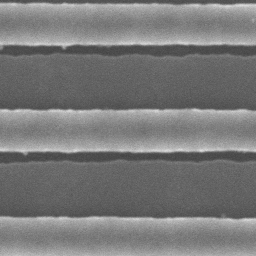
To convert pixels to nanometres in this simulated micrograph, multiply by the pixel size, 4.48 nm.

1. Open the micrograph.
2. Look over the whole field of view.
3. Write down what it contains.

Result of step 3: lines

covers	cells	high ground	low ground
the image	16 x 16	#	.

################
################
################
................
................
................
................
################
################
................
................
................
................
................
################
################